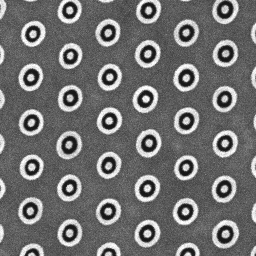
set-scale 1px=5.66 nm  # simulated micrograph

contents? a regular array of ring-shaped raised bodies with a dot in the middle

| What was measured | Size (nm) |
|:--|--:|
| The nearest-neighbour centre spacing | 248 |